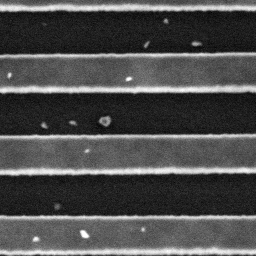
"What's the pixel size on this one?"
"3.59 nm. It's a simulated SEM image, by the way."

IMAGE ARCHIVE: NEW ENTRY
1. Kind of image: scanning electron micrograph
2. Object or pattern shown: lines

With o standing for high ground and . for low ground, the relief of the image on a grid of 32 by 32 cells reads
oooooooooooooooooooooooooooooooo
................................
................................
................................
................................
................................
................................
oooooooooooooooooooooooooooooooo
oooooooooooooooooooooooooooooooo
oooooooooooooooooooooooooooooooo
oooooooooooooooooooooooooooooooo
oooooooooooo.oooooooooooo.......
................................
................................
................................
................................
................................
oooooooooooooooooooooooooooooooo
oooooooooooooooooooooooooooooooo
oooooooooooooooooooooooooooooooo
oooooooooooooooooooooooooooooooo
oooooooooooooooooooooooooooooooo
................................
................................
................................
................................
................................
oooooooooooooooooooooooooooooooo
oooooooooooooooooooooooooooooooo
oooooooooooooooooooooooooooooooo
oooooooooooooooooooooooooooooooo
oooooooooooooooooooooooooooooooo